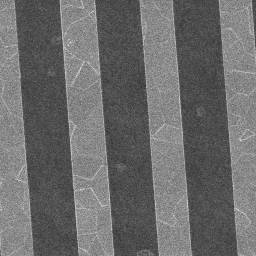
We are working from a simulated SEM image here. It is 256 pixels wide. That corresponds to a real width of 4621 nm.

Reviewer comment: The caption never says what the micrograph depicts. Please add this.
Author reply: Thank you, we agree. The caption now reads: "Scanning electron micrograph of one or a few lines or trenches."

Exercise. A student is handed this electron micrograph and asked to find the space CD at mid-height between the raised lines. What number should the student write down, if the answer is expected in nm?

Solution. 819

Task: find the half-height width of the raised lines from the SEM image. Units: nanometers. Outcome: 533